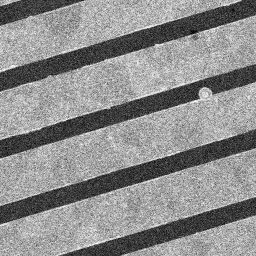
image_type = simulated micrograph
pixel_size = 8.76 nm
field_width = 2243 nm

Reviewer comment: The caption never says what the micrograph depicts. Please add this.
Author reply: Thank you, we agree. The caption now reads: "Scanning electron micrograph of one or a few lines or trenches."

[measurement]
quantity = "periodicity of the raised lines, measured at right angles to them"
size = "559 nm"